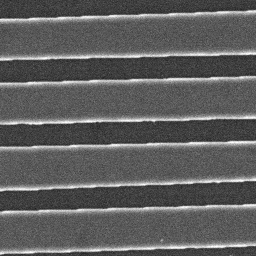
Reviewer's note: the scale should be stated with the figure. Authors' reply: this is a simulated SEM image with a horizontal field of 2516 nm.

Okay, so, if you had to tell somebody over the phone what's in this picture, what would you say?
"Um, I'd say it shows lines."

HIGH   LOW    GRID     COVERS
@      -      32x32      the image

--------------------------------
---------------------------@@@@@
@@@@@@@@@@@@@@@@@@@@@@@@@@@@@@@@
@@@@@@@@@@@@@@@@@@@@@@@@@@@@@@@@
@@@@@@@@@@@@@@@@@@@@@@@@@@@@@@@@
@@@@@@@@@@@@@@@@@@@@@@@@@@@@@@@@
@@@@@@@@@@@@@@@@@@@@@@@@@@@@@@@@
--------------------------------
--------------------------------
--------------------------------
@@@@@@@@@@@@@@@@@@@@@@@@@@@@@@@@
@@@@@@@@@@@@@@@@@@@@@@@@@@@@@@@@
@@@@@@@@@@@@@@@@@@@@@@@@@@@@@@@@
@@@@@@@@@@@@@@@@@@@@@@@@@@@@@@@@
@@@@@@@@@@@@@@@@@@@@@@@@@@@@@@@@
--------------------------------
--------------------------------
--------------------------------
@@@@@@@@@@@@@@@@@@@@@@@@@@@@@@@@
@@@@@@@@@@@@@@@@@@@@@@@@@@@@@@@@
@@@@@@@@@@@@@@@@@@@@@@@@@@@@@@@@
@@@@@@@@@@@@@@@@@@@@@@@@@@@@@@@@
@@@@@@@@@@@@@@@@@@@@@@@@@@@@@@@@
@@@@@@@-------------------------
--------------------------------
--------------------------------
@@@@@@@@@@@@@@@@@@@@@@@@@@@@@@@@
@@@@@@@@@@@@@@@@@@@@@@@@@@@@@@@@
@@@@@@@@@@@@@@@@@@@@@@@@@@@@@@@@
@@@@@@@@@@@@@@@@@@@@@@@@@@@@@@@@
@@@@@@@@@@@@@@@@@@@@@@@@@@@@@@@@
@@@@@---------------------------